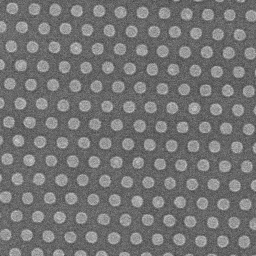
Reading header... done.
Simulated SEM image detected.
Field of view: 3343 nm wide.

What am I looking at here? a regular array of raised bodies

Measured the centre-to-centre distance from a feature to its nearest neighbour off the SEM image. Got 277 nm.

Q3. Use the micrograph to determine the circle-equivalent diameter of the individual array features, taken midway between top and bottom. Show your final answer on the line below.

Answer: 0.144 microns